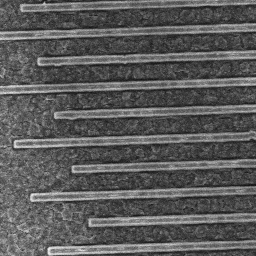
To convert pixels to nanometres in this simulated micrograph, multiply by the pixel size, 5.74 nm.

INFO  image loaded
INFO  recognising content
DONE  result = parallel lines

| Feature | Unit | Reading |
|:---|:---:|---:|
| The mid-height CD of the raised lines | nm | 38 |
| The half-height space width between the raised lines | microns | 0.12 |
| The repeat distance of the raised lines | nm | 155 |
